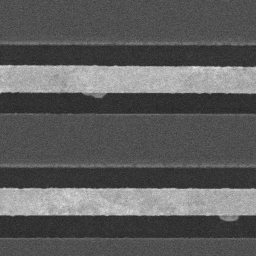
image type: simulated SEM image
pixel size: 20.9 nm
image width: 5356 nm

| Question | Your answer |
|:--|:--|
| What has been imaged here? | lines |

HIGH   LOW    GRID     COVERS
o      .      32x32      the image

oooooooooooooooooooooooooooooooo
oooooooooooooooooooooooooooooooo
oooooooooooooooooooooooooooooooo
oooooooooooooooooooooooooooooooo
oooooooooooooooooooooooooooooooo
..oooooooooooooooooooooooooooooo
................................
................................
oooooooooooooooooooooooooooooooo
oooooooooooooooooooooooooooooooo
oooooooooooooooooooooooooooooooo
oo.ooooooooooooooooooooooooooooo
................................
................................
oooooooooooooooooooooooooooooooo
oooooooooooooooooooooooooooooooo
oooooooooooooooooooooooooooooooo
oooooooooooooooooooooooooooooooo
oooooooooooooooooooooooooooooooo
oooooooooooooooooooooooooooooooo
oooooooooooooooooooooooooooooooo
................................
................................
................................
oooooooooooooooooooooooooooooooo
oooooooooooooooooooooooooooooooo
oooooooooooooooooooooooooooooooo
................................
................................
................................
oooooooooooooooooooooooooooooooo
oooooooooooooooooooooooooooooooo